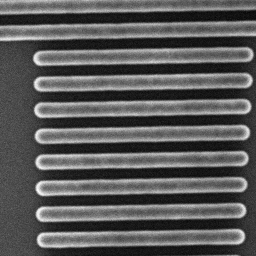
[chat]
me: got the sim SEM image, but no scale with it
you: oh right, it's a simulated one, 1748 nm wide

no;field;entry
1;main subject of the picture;groups of lines, slits or small figures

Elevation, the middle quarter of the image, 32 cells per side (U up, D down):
DDDDDDDDDDDDDDDDDDDDDDDDDDDDDDDD
DDDDDDDDDDDDDDDDDDDDDDDDDDDDDDDD
DDDDDDDDDDDDDDDDDDDDDDDDDDDDDDDD
UUUUUUUUUUUUUUUUUUUUUUUUUUUUUUUU
UUUUUUUUUUUUUUUUUUUUUUUUUUUUUUUU
UUUUUUUUUUUUUUUUUUUUUUUUUUUUUUUU
UUDDDDDDDDDDDDDDDDDDDDDDDDDDDDDD
DDDDDDDDDDDDDDDDDDDDDDDDDDDDDDDD
DDDDDDDDDDDDDDDDDDDDDDDDDDDDDDDD
DDDDDDDDDDDDDDDDDUUUUUUUUUUUUUUU
UUUUUUUUUUUUUUUUUUUUUUUUUUUUUUUU
UUUUUUUUUUUUUUUUUUUUUUUUUUUUUUUU
UUUUUUUUUUUUUUUUUUUUUUUUUUUUUUUU
DDDDDDDDDDDDDDDDDDDDDDDDDDDDDDDD
DDDDDDDDDDDDDDDDDDDDDDDDDDDDDDDD
DDDDDDDDDDDDDDDDDDDDDDDDDDDDDDDD
UUUUUUUUUUUUUUUUUUUUUUUUUUUUUUUU
UUUUUUUUUUUUUUUUUUUUUUUUUUUUUUUU
UUUUUUUUUUUUUUUUUUUUUUUUUUUUUUUU
UUUDDDDDDDDDDDDDDDDDDDDDDDDDDDDD
DDDDDDDDDDDDDDDDDDDDDDDDDDDDDDDD
DDDDDDDDDDDDDDDDDDDDDDDDDDDDDDDD
DDDDDDDDDDDDDDDDDDDUUUUUUUUUUUUU
UUUUUUUUUUUUUUUUUUUUUUUUUUUUUUUU
UUUUUUUUUUUUUUUUUUUUUUUUUUUUUUUU
UUUUUUUUUUUUUUUUUUUUUUUUUUUUUUUU
DDDDDDDDDDDDDDDDDDDDDDDDDDDDDDDD
DDDDDDDDDDDDDDDDDDDDDDDDDDDDDDDD
DDDDDDDDDDDDDDDDDDDDDDDDDDDDDDDD
UUUUUUUUUUUUUUUUUUUUUUUUUUUUUUUU
UUUUUUUUUUUUUUUUUUUUUUUUUUUUUUUU
UUUUUUUUUUUUUUUUUUUUUUUUUUUUUUUU